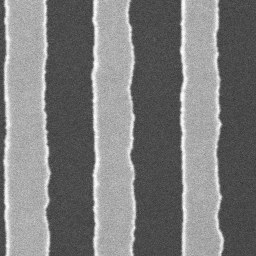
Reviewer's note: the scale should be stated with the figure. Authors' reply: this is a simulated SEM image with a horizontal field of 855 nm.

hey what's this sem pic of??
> lines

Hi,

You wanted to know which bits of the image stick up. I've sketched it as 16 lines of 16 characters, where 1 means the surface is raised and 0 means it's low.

1110001100011100
1110001100011100
1110001100011000
1110001100011100
1110001100001100
1110001100011100
1110001100011100
1110001100011100
1110001100011100
1110001100011000
1110001100011100
1110001100011100
1110001100011100
1110001100001100
1110001100011100
1110001100011100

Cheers